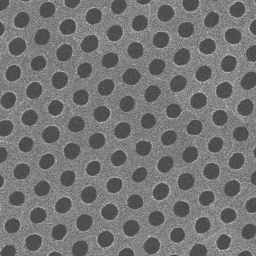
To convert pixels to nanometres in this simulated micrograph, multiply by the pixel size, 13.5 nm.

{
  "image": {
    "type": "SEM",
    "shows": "a regular array of holes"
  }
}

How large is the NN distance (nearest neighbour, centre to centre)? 360 nanometres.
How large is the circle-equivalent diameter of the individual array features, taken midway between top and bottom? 220 nm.